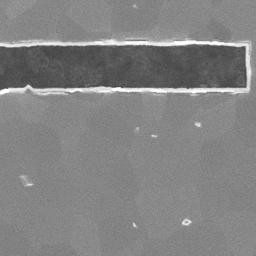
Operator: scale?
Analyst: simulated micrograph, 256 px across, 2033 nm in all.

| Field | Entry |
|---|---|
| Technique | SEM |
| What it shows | one or a few lines or trenches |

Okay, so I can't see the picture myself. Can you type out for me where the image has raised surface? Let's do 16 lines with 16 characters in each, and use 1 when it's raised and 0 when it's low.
1111111111111111
1111111111111111
1111111111111111
0000000000000001
0000000000000001
0000000000000001
1111111111111111
1111111111111111
1111111111111111
1111111111111111
1111111111111111
1111111111111111
1111111111111111
1111111111111111
1111111111111111
1111111111111111